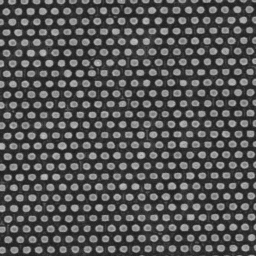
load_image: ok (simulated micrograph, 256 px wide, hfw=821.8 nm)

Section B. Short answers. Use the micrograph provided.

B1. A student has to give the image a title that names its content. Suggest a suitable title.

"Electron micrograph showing a regular array of raised bodies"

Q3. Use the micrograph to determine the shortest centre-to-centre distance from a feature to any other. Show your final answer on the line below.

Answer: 37.3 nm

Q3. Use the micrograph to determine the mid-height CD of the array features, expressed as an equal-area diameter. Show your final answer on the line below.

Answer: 0.0232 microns